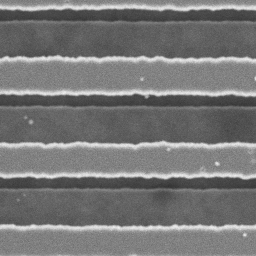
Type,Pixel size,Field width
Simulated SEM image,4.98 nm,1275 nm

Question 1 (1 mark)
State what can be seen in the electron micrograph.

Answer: lines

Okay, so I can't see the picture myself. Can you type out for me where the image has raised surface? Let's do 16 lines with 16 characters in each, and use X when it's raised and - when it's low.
XXXXXXXXXXXXXXXX
----------------
----------------
----------------
XXXXXXXXXXXXXXXX
XXXXXXXXXXXXXXXX
----------------
----------------
----------------
XXXXXXXXXXXXXXXX
XXXXXXXXXXXXXXXX
----------------
----------------
----------------
XXXXXXXXXXXXXXXX
XXXXXXXXXXXXXXXX